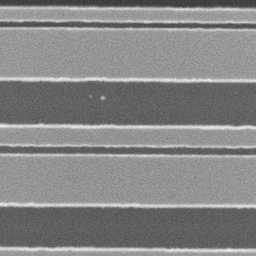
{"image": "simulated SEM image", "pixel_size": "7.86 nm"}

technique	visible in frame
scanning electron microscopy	lines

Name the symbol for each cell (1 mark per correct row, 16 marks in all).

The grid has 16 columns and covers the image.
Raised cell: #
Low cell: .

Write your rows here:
###########.....
################
################
################
################
................
................
................
################
################
################
################
################
................
................
................